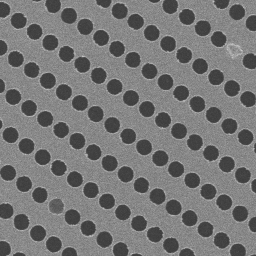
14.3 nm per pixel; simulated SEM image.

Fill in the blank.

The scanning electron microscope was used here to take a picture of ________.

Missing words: a regular array of holes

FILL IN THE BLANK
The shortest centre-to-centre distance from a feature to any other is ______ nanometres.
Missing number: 277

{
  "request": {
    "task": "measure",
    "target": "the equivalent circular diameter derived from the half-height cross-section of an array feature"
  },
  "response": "227 nm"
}